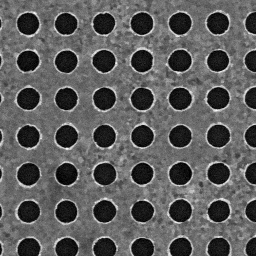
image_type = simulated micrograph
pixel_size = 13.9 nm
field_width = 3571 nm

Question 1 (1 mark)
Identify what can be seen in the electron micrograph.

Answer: a regular array of holes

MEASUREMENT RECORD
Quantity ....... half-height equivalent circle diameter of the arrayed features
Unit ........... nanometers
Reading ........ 319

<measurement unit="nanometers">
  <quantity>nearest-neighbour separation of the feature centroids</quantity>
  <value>521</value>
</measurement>